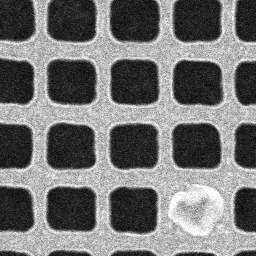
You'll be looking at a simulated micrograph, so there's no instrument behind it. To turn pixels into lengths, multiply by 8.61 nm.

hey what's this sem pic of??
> a regular array of holes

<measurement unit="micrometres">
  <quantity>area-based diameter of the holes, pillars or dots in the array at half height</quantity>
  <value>0.446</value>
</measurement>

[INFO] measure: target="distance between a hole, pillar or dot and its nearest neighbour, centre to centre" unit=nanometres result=537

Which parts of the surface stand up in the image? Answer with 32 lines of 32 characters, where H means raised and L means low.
LLLLHHLLLLLLHHLLLLLLHHLLLLLLHHLL
LLLLHHLLLLLLHHLLLLLLHLLLLLLLHLLL
LLLLHHLLLLLLHHLLLLLLHHLLLLLLHLLL
LLLLHHLLLLLLHHLLLLLLHHLLLLLLHLLL
LLLLHHLLLLLLHHLLLLLLHHLLLLLLHHLL
HHHHHHHHHHHHHHHHHHHHHHHHHHHHHHHH
HHHHHHHHHHHHHHHHHHHHHHHHHHHHHHHH
LHHHHHHLLHLHHHHLLLLHHHHHHHHHHHHH
LLLLHHLLLLLLHHLLLLLLHHLLLLLLHLLL
LLLLHHLLLLLLHHLLLLLLHHLLLLLLHLLL
LLLLHHLLLLLLHHLLLLLLHHLLLLLLHLLL
LLLLHHLLLLLLHHLLLLLLHHLLLLLLHLLL
LLLLHHLLLLLLHHLLLLLLHHLLLLLLHHLL
HHHHHHHHHHHHHHHHHHHHHHHHHHHHHHHH
HHHHHHHHHHHHHHHHHHHHHHHHHHHHHHHH
LLLHHHHLLHHHHHHLLLLHHHLLLLHHHHLL
LLLLHHLLLLLLHHLLLLLLHHLLLLLHHLLL
LLLLHHLLLLLLHHLLLLLLHLLLLLLLHLLL
LLLLHHLLLLLLHHLLLLLLHHLLLLLLHLLL
LLLLHHLLLLLLHHLLLLLLHLLLLLLLHLLL
LLLLHHLLLLLLHHLLLLLLHHLLLLLLHHLL
HHHHHHHHHHHHHHHHHHHHHHHHHHHHHHHH
HHHHHHHHHHHHHHHHHHHHHHHHHHHHHHHH
LLLHHHHLLLLHHHHLLLLHHHHHHHHHHHLL
LLLLHHLLLLLLHHLLLLLLHHHHHHHHHLLL
LLLLHHLLLLLLHHLLLLLLHHHHHHHHHLLL
LLLLHHLLLLLLHHLLLLLLHHHHHHHHHLLL
LLLLHHLLLLLLHHLLLLLLHHHHHHHHHLLL
LLLLHHLLLLLLHHLLLLLLHHHHHHHHHHLL
HHHHHHHHHHHHHHHHHHHHHHHHHHHHHHHH
HHHHHHHHHHHHHHHHHHHHHHHHHHHHHHHH
LLLHHHLLLLHHHHLLLLLHHHHLLHHHHHLL